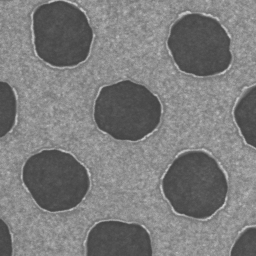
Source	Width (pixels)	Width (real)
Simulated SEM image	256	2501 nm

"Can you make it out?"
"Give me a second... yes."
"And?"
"holes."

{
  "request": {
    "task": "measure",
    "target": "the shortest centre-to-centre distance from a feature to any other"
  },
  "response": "963 nanometers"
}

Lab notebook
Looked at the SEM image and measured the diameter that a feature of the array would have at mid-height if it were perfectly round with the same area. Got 0.62 um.